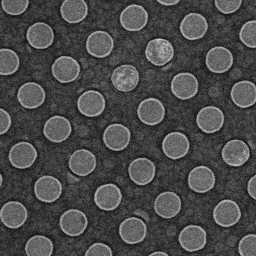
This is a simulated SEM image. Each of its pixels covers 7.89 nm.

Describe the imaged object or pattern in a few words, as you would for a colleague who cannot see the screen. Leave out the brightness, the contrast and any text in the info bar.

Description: a regular array of raised bodies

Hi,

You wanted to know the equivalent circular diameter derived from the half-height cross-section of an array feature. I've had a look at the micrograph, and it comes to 204 nm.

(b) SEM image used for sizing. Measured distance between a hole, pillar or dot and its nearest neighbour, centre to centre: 332 nm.